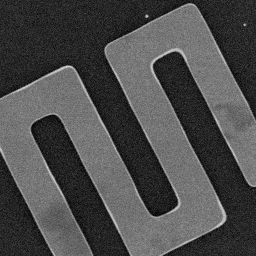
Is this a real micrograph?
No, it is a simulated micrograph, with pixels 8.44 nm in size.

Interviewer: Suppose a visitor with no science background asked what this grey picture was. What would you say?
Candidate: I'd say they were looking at groups of lines, slits or small figures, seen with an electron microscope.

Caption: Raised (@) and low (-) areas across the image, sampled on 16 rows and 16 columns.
-----------@----
---------@@@@---
-------@@@@@@---
-------@@@-@@@--
---@@--@@@--@@--
-@@@@---@@--@@@-
@@@@@@--@@@--@@-
@@--@@---@@---@@
@@--@@@--@@@--@@
@@@--@@---@@---@
-@@--@@@--@@@--@
-@@@--@@---@@---
--@@--@@@--@@@--
--@@@--@@@@@@@--
---@@--@@@@@@---
---@@@--@@@-----